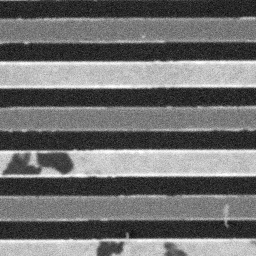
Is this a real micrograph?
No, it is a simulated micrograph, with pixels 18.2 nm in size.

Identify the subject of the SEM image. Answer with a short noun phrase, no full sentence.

lines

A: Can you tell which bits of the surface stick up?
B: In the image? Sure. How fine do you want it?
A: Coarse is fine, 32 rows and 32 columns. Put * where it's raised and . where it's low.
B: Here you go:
................................
................................
********************************
********************************
********************************
................................
................................
................................
********************************
********************************
********************************
................................
................................
.*******************************
********************************
********************************
................................
................................
................................
********************************
********************************
********************************
................................
................................
................................
********************************
********************************
***********.**..............*...
................................
................................
********************************
********************************